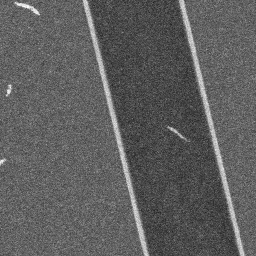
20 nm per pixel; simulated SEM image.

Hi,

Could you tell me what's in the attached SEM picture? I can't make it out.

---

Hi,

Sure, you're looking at one or a few lines or trenches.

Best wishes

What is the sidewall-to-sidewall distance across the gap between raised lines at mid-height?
1880 nm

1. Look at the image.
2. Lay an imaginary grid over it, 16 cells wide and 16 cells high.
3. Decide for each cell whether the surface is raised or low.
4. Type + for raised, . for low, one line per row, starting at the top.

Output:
+++++......+++++
++++++......++++
++++++......++++
++++++......++++
++++++......++++
+++++++......+++
+++++++......+++
+++++++......+++
+++++++......+++
++++++++......++
++++++++......++
++++++++......++
++++++++......++
+++++++++......+
+++++++++......+
+++++++++......+